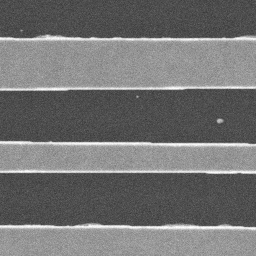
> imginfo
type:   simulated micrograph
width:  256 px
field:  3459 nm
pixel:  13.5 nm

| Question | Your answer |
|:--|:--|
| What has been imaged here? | lines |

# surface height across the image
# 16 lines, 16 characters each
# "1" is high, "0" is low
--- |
0000000000000000
0000000000000000
1111111111111111
1111111111111111
1111111111111111
1111111111110000
0000000000000000
0000000000000000
0000000000000000
1111111111111111
1111111111111111
0000000000000000
0000000000000000
0000000000000000
1111111111111111
1111111111111111